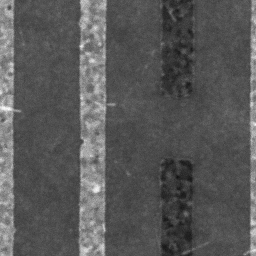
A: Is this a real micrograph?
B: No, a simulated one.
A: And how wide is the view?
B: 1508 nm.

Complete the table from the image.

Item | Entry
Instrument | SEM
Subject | one or a few lines or trenches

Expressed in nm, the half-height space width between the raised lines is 342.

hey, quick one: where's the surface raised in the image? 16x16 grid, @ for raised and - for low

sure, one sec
@----@@---@@----
@----@@---@@----
@----@@---@@----
@----@@---@@----
@----@@---@@----
@----@@---@@----
@----@@---------
@----@@---------
@----@@---------
@----@@---------
@----@@---@@----
@----@@---@@----
@----@@---@@----
@----@@---@@----
@----@@---@@----
@----@@---@@----